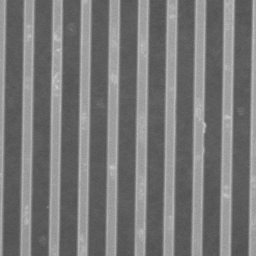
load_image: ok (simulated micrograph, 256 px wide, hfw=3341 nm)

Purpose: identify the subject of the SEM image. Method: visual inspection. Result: parallel lines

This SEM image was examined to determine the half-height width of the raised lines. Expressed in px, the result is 9.88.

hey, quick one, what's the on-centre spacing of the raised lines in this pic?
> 373 nm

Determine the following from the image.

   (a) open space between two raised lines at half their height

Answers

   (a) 245 nm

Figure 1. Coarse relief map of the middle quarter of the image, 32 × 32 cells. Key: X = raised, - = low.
----XX-----XXX----XXX-----XX----
----XX-----XXX----XXX-----XX----
----XX-----XX-----XXX-----XX----
----XX-----XX-----XXX-----XX----
----XX-----XX-----XXX-----XX----
----XX-----XX-----XXX-----XX----
----XX-----XX-----XXX-----XX----
----XX-----XX-----XXX-----XX----
----XX-----XX-----XXX-----XX----
----XX-----XX-----XXX-----XX----
----XX-----XX-----XXX-----XX----
----XX-----XX-----XXX----XXX----
----XX-----XX-----XXX----XXX----
----XX-----XX-----XXX----XXX----
----XX-----XX-----XXX----XXX----
----XX-----XX-----XXX----XXX----
----XX-----XX-----XXX----XXX----
----XX-----XX-----XXX----XXX----
----XX-----XX-----XXX----XXX----
----XX-----XX-----XXX----XXX----
----XX-----XX-----XXX----XXX----
----XX-----XX-----XXX----XXX----
----XX-----XX-----XXX----XXX----
----XX-----XX-----XXX----XXX----
----XX-----XX-----XXX----XXX----
----XX-----XX-----XXX----XXX----
----XX-----XX-----XXX----XXX----
----XX-----XX-----XXX----XX-----
----XX-----XX-----XXX----XX-----
----XX-----XX-----XXX----XX-----
----XX-----XX-----XX-----XX-----
----XX-----XX-----XX-----XX-----